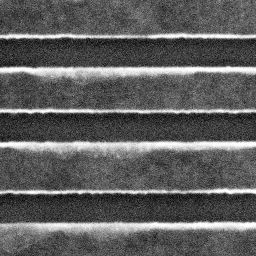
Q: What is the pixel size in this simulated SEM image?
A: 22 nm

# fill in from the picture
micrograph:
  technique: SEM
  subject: lines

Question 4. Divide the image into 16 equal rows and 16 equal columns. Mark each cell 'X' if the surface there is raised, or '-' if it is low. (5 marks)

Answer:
XXXXXXXXXXXXXXXX
XXXXXXXXXXXXXXXX
----------------
----------------
XXXXXXXXXXXXXXXX
XXXXXXXXXXXXXXXX
XXXXXXXXXXXXXXXX
----------------
----------------
XXXXXXXXXXXXXXXX
XXXXXXXXXXXXXXXX
XXXXXXXXXXXXXXXX
----------------
----------------
XXXXXXXXXXXXXXXX
XXXXXXXXXXXXXXXX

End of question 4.